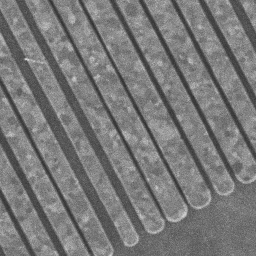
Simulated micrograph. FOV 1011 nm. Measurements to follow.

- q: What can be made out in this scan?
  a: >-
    parallel lines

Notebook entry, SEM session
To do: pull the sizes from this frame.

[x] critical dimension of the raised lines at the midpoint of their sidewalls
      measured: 0.0769 µm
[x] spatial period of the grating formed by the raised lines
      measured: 106 nanometres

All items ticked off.